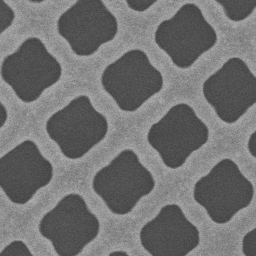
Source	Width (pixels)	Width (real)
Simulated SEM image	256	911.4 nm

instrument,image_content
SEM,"holes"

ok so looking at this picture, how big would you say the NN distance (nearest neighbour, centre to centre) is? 0.255 um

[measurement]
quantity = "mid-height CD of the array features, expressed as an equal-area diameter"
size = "200 nm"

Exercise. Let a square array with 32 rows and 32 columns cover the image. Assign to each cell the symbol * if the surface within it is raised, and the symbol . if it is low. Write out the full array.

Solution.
.********....***...****.***.....
..******......********...***...*
..*****.......*******.....***.**
.******........*****.......*****
********......*****........*****
***..****....*******.......*****
**....***...****..***.....******
*......********....**....****.**
........*****......*********...*
........*****.......******......
*......******.......*****.......
**...********.......*****.......
***.*****..***....********......
.*******....***..****...***....*
.*****.......*******.....**...**
******.......******......*******
******.......******.......******
*******......******.......*****.
**...***...********......******.
.....***..*****..***....********
......********....***..****..***
.......*****.......*******....**
......******.......******......*
.....*******.......*****........
*...****..**......******........
*******....**....********......*
******.....***..****...***....**
*****.......*******.....***..***
*****.......******......********
*****.......*****........******.
*..****....*******.......*****..
....***...****.****.....******..